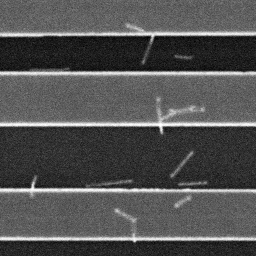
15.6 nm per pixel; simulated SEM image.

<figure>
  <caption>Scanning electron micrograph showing lines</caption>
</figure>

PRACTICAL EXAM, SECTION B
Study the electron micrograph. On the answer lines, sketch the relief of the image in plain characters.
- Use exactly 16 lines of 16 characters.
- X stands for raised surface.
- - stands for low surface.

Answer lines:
XXXXXXXXXXXXXXXX
XXXXXXXXXXXXXXXX
----------------
----------------
----------------
XXXXXXXXXXXXXXXX
XXXXXXXXXXXXXXXX
XXXXXXXXXXXXXXXX
----------------
----------------
----------------
----------------
XXXXXXXXXXXXXXXX
XXXXXXXXXXXXXXXX
XXXXXXXXXXXXXXXX
----------------